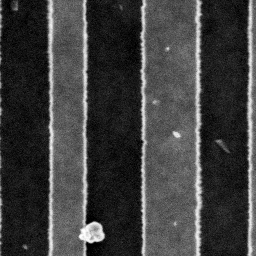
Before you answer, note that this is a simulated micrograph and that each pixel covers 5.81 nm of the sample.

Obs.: lines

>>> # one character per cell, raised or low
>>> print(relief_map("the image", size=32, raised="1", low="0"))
00000011111000000011111110000001
00000011111000000011111110000001
00000011111000000011111110000001
00000011111000000011111110000001
00000011111000000011111110000001
00000011111000000011111110000001
00000011111000000011111110000001
00000011111000000011111110000001
00000011111000000011111110000001
00000011111000000011111110000001
00000011111000000011111110000001
00000011111000000011111110000001
00000011111000000011111110000001
00000011111000000011111110000001
00000011111000000011111110000001
00000011111000000011111110000001
00000011111000000011111110000001
00000011111000000011111110000001
00000011111000000011111110000001
00000011111000000011111110000001
00000011111000000011111110000001
00000011111000000011111110000001
00000011111000000011111110000001
00000011111000000011111110000001
00000011111000000011111110000001
00000011111000000011111110000001
00000011111000000011111110000001
00000011111000000011111110000001
00000011111110000011111110000001
00000011111110000011111110000001
00000011111000000011111110000001
00000011111000000011111110000001